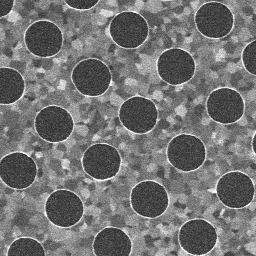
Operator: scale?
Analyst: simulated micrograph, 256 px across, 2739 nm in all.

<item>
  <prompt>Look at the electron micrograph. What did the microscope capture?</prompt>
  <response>a regular array of holes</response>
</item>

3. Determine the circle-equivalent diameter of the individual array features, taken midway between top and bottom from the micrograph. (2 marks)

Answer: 405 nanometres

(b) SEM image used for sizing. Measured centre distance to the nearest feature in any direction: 640 nm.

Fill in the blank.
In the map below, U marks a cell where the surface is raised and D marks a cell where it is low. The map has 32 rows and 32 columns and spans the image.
DDUUUUUUDDDDUUUUUUUUUUUUUUDDUUUU
DUUUUUUUUUUUUUUDDUUUUUUUUDDDDUUU
UUUUUUUUUUUUUUDDDDUUUUUUDDDDDUUU
UUUUDDDUUUUUUUDDDDUUUUUUUDDDDUUU
UUUDDDDDUUUUUUDDDDUUUUUUUUDDUUUU
UUUDDDDDUUUUUUUDDDUUUUUUUUUUUUUD
UUUUDDDUUUUUUUUUUUUUDDDUUUUUUUDD
UUUUUUUUUUUDUUUUUUUUDDDDUUUUUUDD
DUUUUUUUUDDDDUUUUUUUDDDDUUUUUUUD
DDDUUUUUUDDDDDUUUUUUDDDDUUUUUUUU
DDDUUUUUUDDDDDUUUUUUUDDUUUUUUUUU
DDDUUUUUUUDDDUUUUUUUUUUUUUUDDDUU
DDUUUUUUUUUUUUUUDDDUUUUUUUDDDDUU
UUUUUUDDUUUUUUUDDDDDUUUUUUDDDDDU
UUUUUDDDDUUUUUUDDDDDUUUUUUDDDDUU
UUUUDDDDDUUUUUUDDDDUUUUUUUUUUUUU
UUUUUDDDDUUUUUUUUDUUUUUUUUUUUUUU
UUUUUUDDUUUUUUUUUUUUUDDDDUUUUUUU
UUUUUUUUUUUDDDUUUUUUUDDDDDUUUUUU
UDDDUUUUUUDDDDDUUUUUUDDDDDUUUUUU
DDDDUUUUUUDDDDDUUUUUUDDDDUUUUUUU
DDDDDUUUUUUDDDDUUUUUUUUUUUUUUDUU
DDDDUUUUUUUUUUUUUUUUUUUUUUUDDDDU
UUDUUUUUUUUUUUUUUDDDUUUUUUUDDDDD
UUUUUUDDDDUUUUUUDDDDDUUUUUUDDDDD
UUUUUUDDDDUUUUUUDDDDDUUUUUUUDDDU
UUUUUUDDDDUUUUUUUDDDUUUUUUUUUUUU
UUUUUUDDDDUUUUUUUUUUUUUUDUUUUUUU
UUUUUUUUUUUUUDDUUUUUUUUDDDDUUUUU
UUUUUUUUUUUUDDDDUUUUUUDDDDDUUUUU
UDDDDUUUUUUUDDDDUUUUUUUDDDDUUUUU
UDDDDDUUUUUUDDDDUUUUUUUDDDUUUUUU